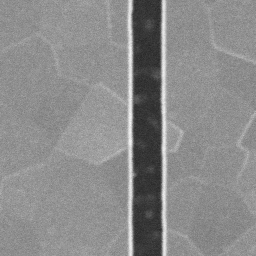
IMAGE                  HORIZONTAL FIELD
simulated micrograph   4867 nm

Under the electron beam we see one or a few lines or trenches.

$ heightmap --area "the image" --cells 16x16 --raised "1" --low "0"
1111111100111111
1111111100111111
1111111100111111
1111111100111111
1111111100111111
1111111100111111
1111111100111111
1111111100111111
1111111100111111
1111111100111111
1111111100111111
1111111100111111
1111111100111111
1111111100111111
1111111100111111
1111111100111111